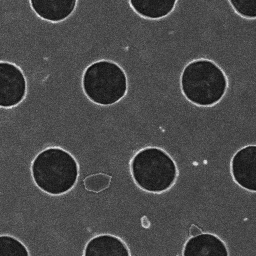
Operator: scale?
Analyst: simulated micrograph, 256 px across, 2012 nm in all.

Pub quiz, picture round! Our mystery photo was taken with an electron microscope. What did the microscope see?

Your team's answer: holes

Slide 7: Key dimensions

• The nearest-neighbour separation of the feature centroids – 777 nanometres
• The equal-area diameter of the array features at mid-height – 344 nm